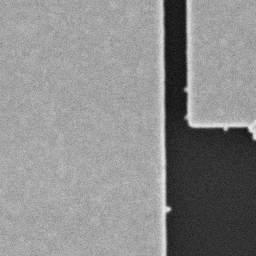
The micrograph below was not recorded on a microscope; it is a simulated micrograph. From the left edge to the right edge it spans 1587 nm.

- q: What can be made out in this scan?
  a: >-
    wiring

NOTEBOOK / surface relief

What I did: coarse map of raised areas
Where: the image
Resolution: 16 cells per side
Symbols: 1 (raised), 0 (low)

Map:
1111111111001111
1111111111001111
1111111111001111
1111111111001111
1111111111001111
1111111111001111
1111111111001111
1111111111001111
1111111111000000
1111111111000000
1111111111000000
1111111111000000
1111111111000000
1111111111000000
1111111111000000
1111111111000000